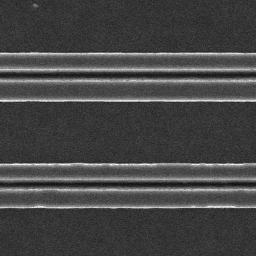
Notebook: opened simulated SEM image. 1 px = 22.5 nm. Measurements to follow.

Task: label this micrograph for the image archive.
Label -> lines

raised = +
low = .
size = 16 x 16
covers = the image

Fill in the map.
................
................
................
++++++++++++++++
++++++++++++++++
++++++++++++++++
................
................
................
................
++++++++++++++++
++++++++++++++++
++++++++++++++++
................
................
................